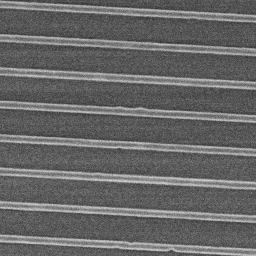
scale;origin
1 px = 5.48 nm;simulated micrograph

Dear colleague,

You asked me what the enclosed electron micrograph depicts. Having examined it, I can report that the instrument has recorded parallel lines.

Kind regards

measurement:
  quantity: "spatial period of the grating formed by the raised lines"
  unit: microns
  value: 0.183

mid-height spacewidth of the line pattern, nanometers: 147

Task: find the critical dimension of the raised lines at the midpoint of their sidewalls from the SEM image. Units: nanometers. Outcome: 36.9